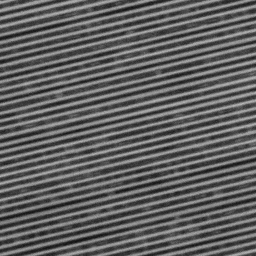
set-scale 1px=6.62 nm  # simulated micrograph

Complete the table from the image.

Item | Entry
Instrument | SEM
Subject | parallel lines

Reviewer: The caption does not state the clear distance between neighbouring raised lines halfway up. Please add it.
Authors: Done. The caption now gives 32.2 nm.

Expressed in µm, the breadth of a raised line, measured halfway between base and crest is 0.0193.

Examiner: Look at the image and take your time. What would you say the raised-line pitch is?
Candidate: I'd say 7.66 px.